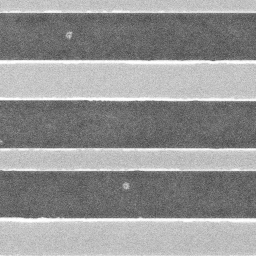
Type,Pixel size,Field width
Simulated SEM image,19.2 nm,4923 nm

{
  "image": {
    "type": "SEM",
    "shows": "lines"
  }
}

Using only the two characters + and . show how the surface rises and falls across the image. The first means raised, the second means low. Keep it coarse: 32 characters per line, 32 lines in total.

++++++++++++++++++++++++++++++++
................................
................................
................................
................................
................................
................................
................................
++++++++++++++++++++++++++++++++
++++++++++++++++++++++++++++++++
++++++++++++++++++++++++++++++++
++++++++++++++++++++++++++++++++
..............++++..++++++++++++
................................
................................
................................
................................
................................
................................
++++++++++++++++++++++++++++++++
++++++++++++++++++++++++++++++++
................................
................................
................................
................................
................................
................................
+++++++++++++++++++++++++++++.+.
++++++++++++++++++++++++++++++++
++++++++++++++++++++++++++++++++
++++++++++++++++++++++++++++++++
++++++++++++++++++++++++++++++++